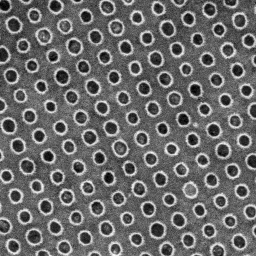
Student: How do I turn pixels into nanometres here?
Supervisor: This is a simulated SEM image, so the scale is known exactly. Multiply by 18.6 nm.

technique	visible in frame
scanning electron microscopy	a regular array of raised bodies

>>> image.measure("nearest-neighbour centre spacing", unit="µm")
0.413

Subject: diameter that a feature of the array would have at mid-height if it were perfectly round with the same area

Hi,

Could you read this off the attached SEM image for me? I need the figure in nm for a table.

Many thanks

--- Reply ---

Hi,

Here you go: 247